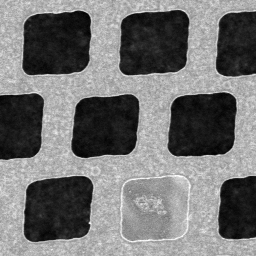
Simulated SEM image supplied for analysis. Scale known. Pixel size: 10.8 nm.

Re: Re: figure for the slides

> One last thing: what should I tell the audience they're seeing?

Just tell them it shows holes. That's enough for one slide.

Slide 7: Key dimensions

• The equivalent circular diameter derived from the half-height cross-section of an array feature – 770 nanometres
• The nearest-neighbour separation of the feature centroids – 95.6 px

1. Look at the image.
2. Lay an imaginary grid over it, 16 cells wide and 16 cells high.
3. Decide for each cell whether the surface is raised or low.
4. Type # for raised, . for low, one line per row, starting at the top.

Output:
################
##....##....##..
#.....##....##..
#.....#.....##..
##...###...###..
################
...##....##....#
...##....##....#
...##....##....#
..###...###...##
################
##....########..
##....########..
#.....########..
#....#########..
################